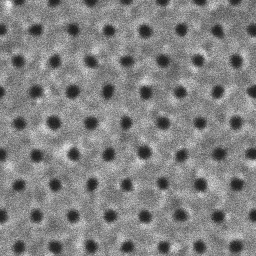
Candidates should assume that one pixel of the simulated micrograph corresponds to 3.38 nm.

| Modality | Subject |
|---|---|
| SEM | a regular array of holes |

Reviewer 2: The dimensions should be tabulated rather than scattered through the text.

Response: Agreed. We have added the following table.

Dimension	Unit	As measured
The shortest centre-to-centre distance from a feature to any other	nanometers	118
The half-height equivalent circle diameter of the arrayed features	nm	44.8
